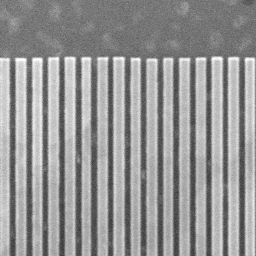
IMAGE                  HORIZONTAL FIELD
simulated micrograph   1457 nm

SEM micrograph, parallel lines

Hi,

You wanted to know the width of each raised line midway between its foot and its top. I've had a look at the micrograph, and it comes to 50.5 nanometres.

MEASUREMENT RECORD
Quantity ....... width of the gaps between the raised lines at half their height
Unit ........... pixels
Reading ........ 7.26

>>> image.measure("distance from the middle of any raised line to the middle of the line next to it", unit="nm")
93